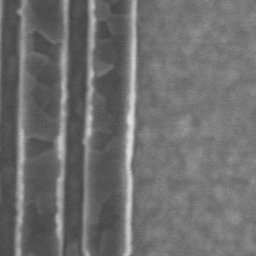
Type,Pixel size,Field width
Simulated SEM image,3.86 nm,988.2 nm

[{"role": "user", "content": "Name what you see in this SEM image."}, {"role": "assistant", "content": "one or a few lines or trenches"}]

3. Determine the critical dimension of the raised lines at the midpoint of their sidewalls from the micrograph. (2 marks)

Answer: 0.177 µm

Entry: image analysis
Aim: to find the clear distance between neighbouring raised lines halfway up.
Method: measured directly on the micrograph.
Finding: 85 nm